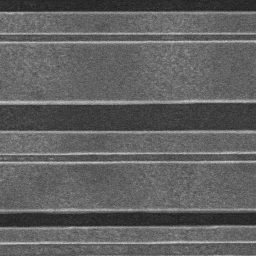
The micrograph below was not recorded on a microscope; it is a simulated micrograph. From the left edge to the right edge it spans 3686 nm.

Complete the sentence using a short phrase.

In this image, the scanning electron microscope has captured lines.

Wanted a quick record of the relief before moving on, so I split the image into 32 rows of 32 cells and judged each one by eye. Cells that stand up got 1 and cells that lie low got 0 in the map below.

00000000000000000000000000000000
00000000000000000000000000000000
11111111111111111111111111111111
11111111111111111111111111111111
11111111111111111111111111111111
11111111111111111111111111111111
11111111111111111111111111111111
11111111111111111111111111111111
11111111111111111111111111111111
11111111111111111111111111111111
11111111111111111111111111111111
11111111111111111111111111111111
11111111111111111111111111111111
00000000000000000000000000000000
00000000000000000000000000000000
00000000000000000000000000000000
00000000000000000000000000000000
11111111111111111111111111111111
11111111111111111111111111111111
11111111111111111111111111111111
11111111111111111111111111111111
11111111111111111111111111111111
11111111111111111111111111111111
11111111111111111111111111111111
11111111111111111111111111111111
11111111111111111111111111111111
00000000000000000000000000000000
00000000000000000000000000000000
00000000111111111111111111111111
11111111111111111111111111111111
11111111111111111111111111111111
11111111111111111111111111111111